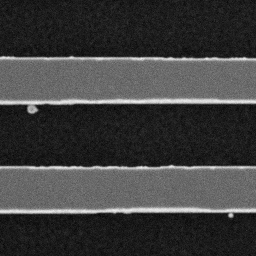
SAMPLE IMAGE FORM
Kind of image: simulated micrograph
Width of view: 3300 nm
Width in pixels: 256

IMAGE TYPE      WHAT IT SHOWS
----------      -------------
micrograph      lines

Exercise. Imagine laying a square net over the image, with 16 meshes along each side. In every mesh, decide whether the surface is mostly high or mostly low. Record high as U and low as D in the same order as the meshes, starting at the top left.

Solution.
DDDDDDDDDDDDDDDD
DDDDDDDDDDDDDDDD
DDDDDDDDDDDDDDDD
DDDDDDDDDDDDDDDD
UUUUUUUUUUUUUUUU
UUUUUUUUUUUUUUUU
DDDDDDDDDDDDDDDD
DDDDDDDDDDDDDDDD
DDDDDDDDDDDDDDDD
DDDDDDDDDDDDDDDD
UUUUUUUUUUUUUUUU
UUUUUUUUUUUUUUUU
UUUUUUUUUUUUUUUU
DDDDDDDDDDDDDDDD
DDDDDDDDDDDDDDDD
DDDDDDDDDDDDDDDD